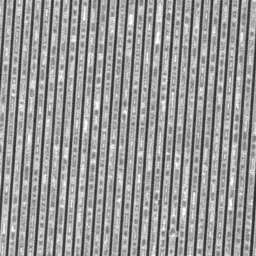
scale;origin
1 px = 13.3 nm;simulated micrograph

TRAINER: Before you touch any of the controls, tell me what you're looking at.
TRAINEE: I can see parallel lines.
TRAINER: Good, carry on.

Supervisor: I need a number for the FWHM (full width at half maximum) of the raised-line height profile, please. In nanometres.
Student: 78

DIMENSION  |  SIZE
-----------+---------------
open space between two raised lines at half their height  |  39.8 nm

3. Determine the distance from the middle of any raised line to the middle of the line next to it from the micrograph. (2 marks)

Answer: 125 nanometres